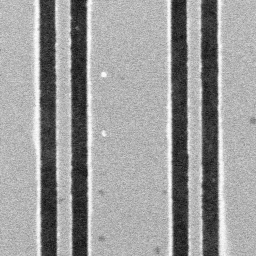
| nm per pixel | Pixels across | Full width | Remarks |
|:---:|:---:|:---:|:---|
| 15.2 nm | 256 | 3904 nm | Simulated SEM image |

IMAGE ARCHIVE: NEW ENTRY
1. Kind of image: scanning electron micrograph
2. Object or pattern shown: lines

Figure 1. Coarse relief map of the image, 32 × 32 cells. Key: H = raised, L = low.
HHHHHLLHHLLHHHHHHHHHHLLHHLLHHHHH
HHHHHLLHHLLHHHHHHHHHHLLHHLLHHHHH
HHHHHLLHHLLHHHHHHHHHHLLHHLLHHHHH
HHHHHLLHHLLHHHHHHHHHHLLHHLLHHHHH
HHHHHLLHHLLHHHHHHHHHHLLHHLLHHHHH
HHHHHLLHHLLHHHHHHHHHHLLHHLLHHHHH
HHHHHLLHHLLHHHHHHHHHHLLLHLLHHHHH
HHHHHLLHHLLHHHHHHHHHHLLHHLLHHHHH
HHHHHLLHHLLHHHHHHHHHHLLHHLLHHHHH
HHHHHLLHHLLHHHHHHHHHHLLLHLLHHHHH
HHHHHLLHHLLHHHHHHHHHHLLLHLLHHHHH
HHHHHLLHHLLHHHHHHHHHHLLLHLLHHHHH
HHHHHLLHHLLHHHHHHHHHHLLLHLLHHHHH
HHHHHLLHHLLHHHHHHHHHHLLLHLLHHHHH
HHHHHLLHHLLHHHHHHHHHHLLLHLLHHHHH
HHHHHLLHHLLHHHHHHHHHHLLLHLLHHHHH
HHHHHLLHHLLHHHHHHHHHHLLLHLLHHHHH
HHHHHLLHHLLHHHHHHHHHHLLLHLLHHHHH
HHHHHLLHHLLHHHHHHHHHHLLLHLLHHHHH
HHHHHLLHHLLHHHHHHHHHHLLLHLLHHHHH
HHHHHLLHHLLHHHHHHHHHHLLLHLLHHHHH
HHHHHLLHHLLHHHHHHHHHHLLLHLLHHHHH
HHHHHLLHHLLHHHHHHHHHHLLLHLLHHHHH
HHHHHLLHHLLHHHHHHHHHHLLLHLLHHHHH
HHHHHLLHHLLHHHHHHHHHHLLLHLLHHHHH
HHHHHLLHHLLHHHHHHHHHHLLLHLLHHHHH
HHHHHLLHHLLHHHHHHHHHHLLLHLLHHHHH
HHHHHLLHHLLHHHHHHHHHHLLLHLLHHHHH
HHHHHLLHHLLHHHHHHHHHHLLLHLLHHHHH
HHHHHLLHHLLHHHHHHHHHHLLLHLLHHHHH
HHHHHLLHHLLHHHHHHHHHHLLLHLLLHHHH
HHHHHLLHHLLHHHHHHHHHHLLLHLLLHHHH